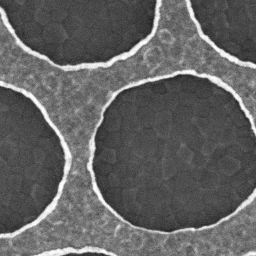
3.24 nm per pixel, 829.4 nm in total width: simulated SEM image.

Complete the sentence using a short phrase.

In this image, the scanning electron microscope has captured holes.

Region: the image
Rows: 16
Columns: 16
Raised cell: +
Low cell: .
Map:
..........++....
+.........++....
+........++++...
+++.....++++++..
++++++++++++++++
.+++++++......++
..+++++........+
...+++..........
....++..........
....++..........
....++..........
....++..........
...++++.........
...++++.......++
.+++++++++.+++++
++++++++++++++++